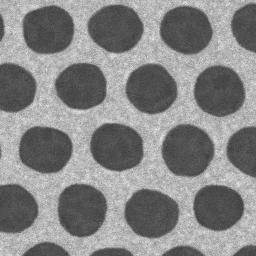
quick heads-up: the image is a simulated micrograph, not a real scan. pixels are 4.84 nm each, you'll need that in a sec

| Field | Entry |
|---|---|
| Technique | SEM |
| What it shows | a regular array of holes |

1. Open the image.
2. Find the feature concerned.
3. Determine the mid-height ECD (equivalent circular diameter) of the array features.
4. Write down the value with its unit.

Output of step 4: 0.247 micrometres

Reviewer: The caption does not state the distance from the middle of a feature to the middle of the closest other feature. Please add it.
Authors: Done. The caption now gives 326 nanometres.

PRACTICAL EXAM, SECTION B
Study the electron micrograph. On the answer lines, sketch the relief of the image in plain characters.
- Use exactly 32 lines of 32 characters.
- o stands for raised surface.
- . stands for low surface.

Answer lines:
oooooooooooooo.oooooooooooooooo.
oooo....oooo.....oooo....oooo...
ooo......oo.......oo......ooo...
.oo......oo.......oo.......oo...
ooo......oo.......oo.......oo...
ooo......ooo.....oooo.....oooo..
oooo...ooooooo..oooooo...ooooooo
oooooooooooooooooooooooooooooooo
...ooooo....ooooo...oooooo...ooo
....ooo......ooo.....oooo.....oo
....ooo......ooo......oo......oo
....ooo......ooo......oo.......o
....oooo.....ooo......oo.......o
...oooooo..oooooo....oooo.....oo
ooooooooooooooooooooooooooo.oooo
ooooooooooooo..oooooooo.oooooooo
ooo.....oooo.....oooo.....ooo...
ooo......oo.......ooo.....ooo...
oo.......oo.......oo.......o....
oo.......ooo......oo.......o....
ooo.....oooo.....oooo.....ooo...
ooooo..oooooooooooooo....ooooo..
oooooooooooooooooooooooooooooooo
...ooooo....ooooooooooooo....ooo
....ooo......ooo.....ooo......oo
.....oo......ooo......oo......oo
.....oo......oo.......oo......oo
....ooo......ooo......ooo.....oo
....oooo....oooo......oooo...ooo
ooooooooo..ooooooo..oooooooooooo
ooooo..ooooooooooooooooooooooooo
ooo.....oooo....ooooo....ooooo..